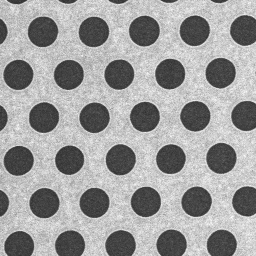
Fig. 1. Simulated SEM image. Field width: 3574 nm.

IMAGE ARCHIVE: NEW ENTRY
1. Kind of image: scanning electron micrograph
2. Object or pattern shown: a regular array of holes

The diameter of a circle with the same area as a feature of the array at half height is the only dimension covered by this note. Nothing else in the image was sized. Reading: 0.422 µm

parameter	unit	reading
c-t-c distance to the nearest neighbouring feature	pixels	49.3